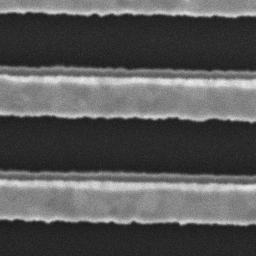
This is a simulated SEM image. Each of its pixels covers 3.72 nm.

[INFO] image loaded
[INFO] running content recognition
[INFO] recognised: lines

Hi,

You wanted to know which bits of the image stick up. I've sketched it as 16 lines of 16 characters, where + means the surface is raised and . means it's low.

++++++++++++++++
................
................
................
++++++++++++++..
++++++++++++++++
++++++++++++++++
............+.++
................
................
................
++++++++++++++++
++++++++++++++++
++++++++++++++++
................
................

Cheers